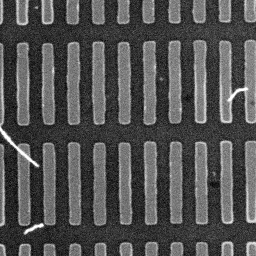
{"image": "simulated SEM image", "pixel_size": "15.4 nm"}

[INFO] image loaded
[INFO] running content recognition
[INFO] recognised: groups of lines, slits or small figures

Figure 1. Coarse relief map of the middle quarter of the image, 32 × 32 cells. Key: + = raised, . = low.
.+++...+++....++....+++...+++...
.+++...+++....+++...+++...+++...
.+++...+++....+++...+++...+++...
.+++...+++....+++...+++...+++...
.+++...+++....++....+++....++...
.++....+++....++....+++...+++...
.++....+++....++....+++...+++...
.++....+++....++....+++...+++...
.+++...+++....+++...+++...+++...
.+++...+++....+++...+++...+++...
.+++...+++....+++...+++...+++...
.+++....++....++....+++...+++...
.+++....++....++....+++...+++...
.+++....++....++....+++...+++...
.+++....++....++....+++....++...
................................
................................
................................
................................
................................
.+++....++....++....+++....++...
.+++....++....++....+++....++...
.+++....++....++....+++....++...
.+++....++....++....+++....++...
.+++....++....++....+++....++...
.+++....++....++....+++....++...
.+++....++....+++...+++....++...
.+++....++....+++...+++....++...
.+++....++....+++...+++....++...
.+++....++....+++...+++....++...
.+++....++....+++...+++....++...
.+++....++....+++...+++....++...